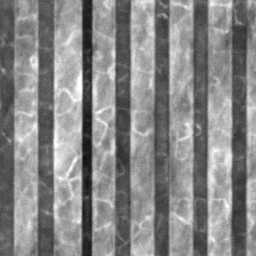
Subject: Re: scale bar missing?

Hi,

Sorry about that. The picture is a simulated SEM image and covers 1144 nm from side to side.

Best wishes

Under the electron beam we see parallel lines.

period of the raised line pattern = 0.173 um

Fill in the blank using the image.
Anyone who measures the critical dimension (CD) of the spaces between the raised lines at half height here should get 0.0693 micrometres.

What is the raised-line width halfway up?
104 nm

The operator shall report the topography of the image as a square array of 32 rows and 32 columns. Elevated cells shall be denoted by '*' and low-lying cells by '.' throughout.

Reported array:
..***..***..**..***..***..***..*
..***..***..**..***..***..***..*
..***..***..**..***..***..***..*
..***..***..**..***..***..***..*
..***..***..**..***..***..***..*
..***..***..**..***..***..***..*
..***..***..**..***..***..***..*
..***..***..**..***..***..***..*
..***..***..**..***..***..***..*
..***..***..**..***..***..***..*
..***..***..**..***..***..***..*
..***..***..**..***..***..***..*
..***..***..**..***..***..***..*
..***..***..**..***..***..***..*
..***..***..**..***..***..***..*
..***..***..**..***..***..***..*
..***..***..**..***..***..***..*
..***..***..**..***..***..***..*
..***..***..**..***..***..***..*
..***..***..**..***..***..***..*
..***..***..**..***..***..***..*
..***..***..**..***..***..***..*
..***..***..**..***..***..***..*
..***..***..**..***..***..***..*
..***..***..**..***..***..***..*
..***..***..**..***..***..***..*
..***..***..**..***..***..***..*
..***..***..**..***..***..***..*
..***..***..**..***..***..***..*
..***..***..**..***..***..***..*
..***..***..**..***..***..***..*
..***..***..**..***..***..***..*